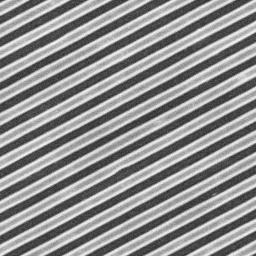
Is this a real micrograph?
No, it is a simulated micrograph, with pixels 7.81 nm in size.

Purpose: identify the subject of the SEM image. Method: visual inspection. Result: parallel lines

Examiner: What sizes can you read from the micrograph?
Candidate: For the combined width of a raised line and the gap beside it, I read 151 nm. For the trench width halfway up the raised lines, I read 80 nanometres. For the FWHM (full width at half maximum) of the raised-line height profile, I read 0.0723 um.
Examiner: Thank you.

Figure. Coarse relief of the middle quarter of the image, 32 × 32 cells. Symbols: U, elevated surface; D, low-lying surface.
UDDDDDDUUUUDDDDDDUUUUUDDDDDUUUUU
DDDDDUUUUDDDDDDUUUUUDDDDDUUUUUDD
DDDUUUUDDDDDDUUUUUDDDDDDUUUUDDDD
DUUUUUDDDDDUUUUUDDDDDDUUUUDDDDDD
UUUUDDDDDUUUUUDDDDDDUUUUDDDDDDUU
UUDDDDDDUUUUDDDDDDUUUUUDDDDDUUUU
DDDDDDUUUUDDDDDDUUUUUDDDDDUUUUUD
DDDDUUUUDDDDDDUUUUUDDDDDDUUUUDDD
DDUUUUUDDDDDUUUUUDDDDDDUUUUDDDDD
UUUUUDDDDDUUUUUDDDDDDUUUUUDDDDDU
UUUDDDDDDUUUUDDDDDDUUUUUDDDDDUUU
UDDDDDDUUUUDDDDDDUUUUUDDDDDUUUUU
DDDDDUUUUDDDDDDUUUUUDDDDDUUUUUDD
DDDUUUUUDDDDDUUUUUDDDDDUUUUUDDDD
DDUUUUDDDDDUUUUUDDDDDUUUUUUDDDDD
UUUUDDDDDDUUUUDDDDDUUUUUUDDDDDUU
UUDDDDDDUUUUDDDDDDUUUUUDDDDDUUUU
DDDDDDUUUUDDDDDDUUUUUDDDDDDUUUUD
DDDDUUUUUDDDDDUUUUUDDDDDDUUUUDDD
DDUUUUUDDDDDUUUUUDDDDDDUUUUDDDDD
UUUUUDDDDDUUUUUDDDDDUUUUUDDDDDDU
UUUDDDDDUUUUUDDDDDDUUUUDDDDDDUUU
UDDDDDUUUUUUDDDDDUUUUDDDDDDUUUUU
DDDDUUUUUUDDDDDUUUUUDDDDDUUUUUDD
DDDUUUUDDDDDDUUUUUDDDDDDUUUUDDDD
DUUUUDDDDDDUUUUDDDDDDDUUUUDDDDDD
UUUUDDDDDUUUUDDDDDDDUUUUDDDDDDUU
UUDDDDDUUUUUDDDDDDUUUUDDDDDDUUUU
DDDDDUUUUUDDDDDDUUUUUDDDDDUUUUUD
DDDDUUUUDDDDDDUUUUUDDDDDUUUUUDDD
DDUUUUDDDDDDDUUUUDDDDDUUUUUDDDDD
UUUUUDDDDDDUUUUDDDDDDUUUUDDDDDDU